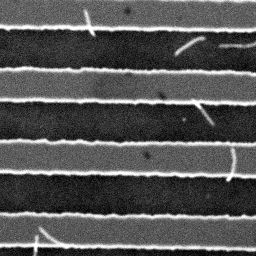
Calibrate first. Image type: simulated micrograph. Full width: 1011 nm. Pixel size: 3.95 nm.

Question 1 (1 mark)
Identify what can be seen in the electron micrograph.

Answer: lines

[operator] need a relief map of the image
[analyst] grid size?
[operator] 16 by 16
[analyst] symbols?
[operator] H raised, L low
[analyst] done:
HHHHHHHHHHHHHHHH
HHHHHHHHHHHHHHHH
LLLLLLLLLLLLLLLL
LLLLLLLLLLLLLLLL
HHHHHHHHHHHHHHHL
HHHHHHHHHHHHHHHH
LLLLLLLLLLLLLHHH
LLLLLLLLLLLLLLLL
LLLLLLLLLLLLLLLL
HHHHHHHHHHHHHHHH
HHHHHHHHHHHHHHHH
LLLLLLLLLLLLLLLL
LLLLLLLLLLLLLLLL
HHHHHHHHHHHHLLLL
HHHHHHHHHHHHHHHH
LLLLLLLLHHHHHHHH